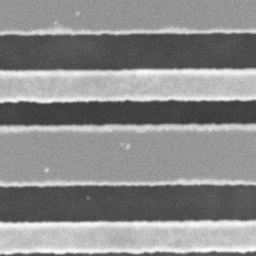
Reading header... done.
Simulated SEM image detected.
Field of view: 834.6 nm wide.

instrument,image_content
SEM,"lines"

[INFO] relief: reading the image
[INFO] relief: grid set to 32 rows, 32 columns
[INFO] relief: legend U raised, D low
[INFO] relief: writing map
UUUUUUUUUUUUUUUUUUUUUUUUUUUUUUUU
UUUUUUUUUUUUUUUUUUUUUUUUUUUUUUUU
UUUUUUUUUUUUUUUUUUUUUUUUUUUUUUUU
UUUUUUUUUUUUUUUUUUUUUUUUUUUUUUUU
DDDDDDDDDDDDDDDDDDDDDDDDDDDDDDDD
DDDDDDDDDDDDDDDDDDDDDDDDDDDDDDDD
DDDDDDDDDDDDDDDDDDDDDDDDDDDDDDDD
DDDDDDDDDDDDDDDDDDDDDDDDDDDDDDDD
DDDDDDDDDDDDDDDDDDDDDDDDDDDDDDDD
UUUUUUUUUUUUUUUUUUUUUUUUUUUUUUUU
UUUUUUUUUUUUUUUUUUUUUUUUUUUUUUUU
UUUUUUUUUUUUUUUUUUUUUUUUUUUUUUUU
UUUUUUUUUUUUUUUUUUUDUDUUUUUUUDUD
DDDDDDDDDDDDDDDDDDDDDDDDDDDDDDDD
DDDDDDDDDDDDDDDDDDDDDDDDDDDDDDDD
DDDDDDDDDDDDDDDDDDDDDDDDDDDDDDDD
UUUUUUUUUUUUUUUUUUUUUUUUUUUUUUUU
UUUUUUUUUUUUUUUUUUUUUUUUUUUUUUUU
UUUUUUUUUUUUUUUUUUUUUUUUUUUUUUUU
UUUUUUUUUUUUUUUUUUUUUUUUUUUUUUUU
UUUUUUUUUUUUUUUUUUUUUUUUUUUUUUUU
UUUUUUUUUUUUUUUUUUUUUUUUUUUUUUUU
UUUUUUUUUUUUUUUUUUUUUUUUUUUUUUUU
DDDDDDDDDDDDDDDDDDDDDDDDDDDDDDDD
DDDDDDDDDDDDDDDDDDDDDDDDDDDDDDDD
DDDDDDDDDDDDDDDDDDDDDDDDDDDDDDDD
DDDDDDDDDDDDDDDDDDDDDDDDDDDDDDDD
DDDDDDDDDDDDDDDDDDDDDDDDDDDDDDDD
UUUUUUUUUUUUUUUUUUUUUUUUUUUUUUUU
UUUUUUUUUUUUUUUUUUUUUUUUUUUUUUUU
UUUUUUUUUUUUUUUUUUUUUUUUUUUUUUUU
UUUUUUUUUUUUUUUDUUUDDDUUDDDDDDUD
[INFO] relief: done